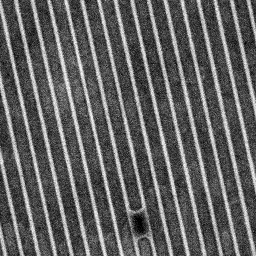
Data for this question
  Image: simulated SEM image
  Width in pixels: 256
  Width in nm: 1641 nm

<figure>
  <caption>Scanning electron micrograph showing parallel lines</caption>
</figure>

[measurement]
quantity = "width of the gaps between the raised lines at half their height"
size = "87.6 nm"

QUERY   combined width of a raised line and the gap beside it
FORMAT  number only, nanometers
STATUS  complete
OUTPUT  104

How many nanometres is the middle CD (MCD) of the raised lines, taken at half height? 18